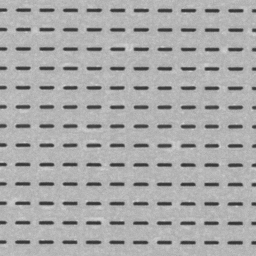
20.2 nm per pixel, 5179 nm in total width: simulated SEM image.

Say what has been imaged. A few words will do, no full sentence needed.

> a regular array of holes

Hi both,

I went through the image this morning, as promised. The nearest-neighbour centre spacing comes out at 385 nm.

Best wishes